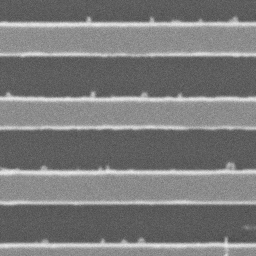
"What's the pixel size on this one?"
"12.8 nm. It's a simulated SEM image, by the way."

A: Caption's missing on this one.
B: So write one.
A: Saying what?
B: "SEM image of lines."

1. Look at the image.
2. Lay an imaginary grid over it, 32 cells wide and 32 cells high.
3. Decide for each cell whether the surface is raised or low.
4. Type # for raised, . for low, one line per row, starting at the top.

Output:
................................
................................
................................
################################
################################
################################
################################
................................
................................
................................
................................
................................
################################
################################
################################
################################
................................
................................
................................
................................
................................
.####.##.#######################
################################
################################
################################
................................
................................
................................
................................
................................
..####.##############..######.##
################################